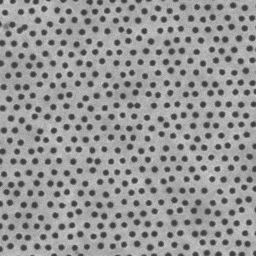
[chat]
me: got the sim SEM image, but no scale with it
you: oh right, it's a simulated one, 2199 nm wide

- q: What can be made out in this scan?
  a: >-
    a regular array of holes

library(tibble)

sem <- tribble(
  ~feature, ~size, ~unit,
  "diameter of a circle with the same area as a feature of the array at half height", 54.8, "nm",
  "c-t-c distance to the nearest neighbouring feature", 89.9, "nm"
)